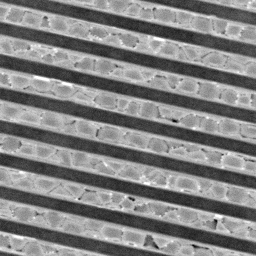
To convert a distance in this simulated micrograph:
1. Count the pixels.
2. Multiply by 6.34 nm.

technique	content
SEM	parallel lines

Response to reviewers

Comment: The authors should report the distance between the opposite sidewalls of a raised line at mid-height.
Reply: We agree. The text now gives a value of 114 nanometers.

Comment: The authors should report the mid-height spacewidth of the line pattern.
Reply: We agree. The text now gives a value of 0.0905 um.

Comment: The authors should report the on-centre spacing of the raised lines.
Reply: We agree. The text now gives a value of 202 nm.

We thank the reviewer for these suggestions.